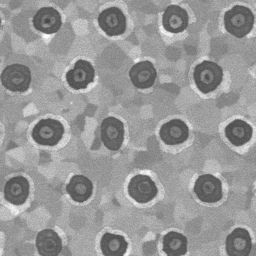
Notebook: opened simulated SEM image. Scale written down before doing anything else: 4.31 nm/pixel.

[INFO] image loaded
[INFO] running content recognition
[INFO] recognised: a regular array of ring-shaped grooves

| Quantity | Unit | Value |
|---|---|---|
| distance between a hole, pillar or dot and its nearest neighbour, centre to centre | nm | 270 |